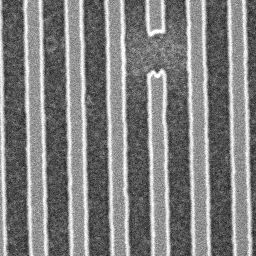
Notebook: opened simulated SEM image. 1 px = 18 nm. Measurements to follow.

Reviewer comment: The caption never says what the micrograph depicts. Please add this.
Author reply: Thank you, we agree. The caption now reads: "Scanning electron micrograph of parallel lines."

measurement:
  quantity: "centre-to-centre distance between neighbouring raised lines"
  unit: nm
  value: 733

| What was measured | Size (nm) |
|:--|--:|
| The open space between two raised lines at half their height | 432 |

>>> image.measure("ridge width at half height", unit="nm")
299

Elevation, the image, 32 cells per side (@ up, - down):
---@@---@@---@@---@@---@@----@@-
---@@---@@---@@---@@---@@@---@@-
---@@---@@---@@---@@----@@---@@-
---@@---@@---@@----@----@@---@@-
---@@---@@---@@---------@@---@@-
---@@---@@---@@---------@@---@@-
---@@---@@---@@---------@@---@@-
---@@---@@---@@@--------@@---@@-
---@@---@@---@@@--------@@---@@-
---@@---@@---@@@---@@---@@---@@-
---@@---@@@---@----@@---@@---@@-
---@@---@@@---@----@@---@@---@@-
---@@---@@----@@---@@---@@---@@-
---@@----@@---@@---@@---@@---@@-
---@@----@----@@---@@---@@---@@-
---@@----@@---@@---@@---@@---@@-
---@@----@@---@@---@@---@@---@@-
----@----@@---@@---@@---@@---@@-
---@@@---@@---@@---@@---@@---@@-
---@@@---@@---@@---@@---@@---@@-
---@@@---@@---@@---@@---@@---@@-
@---@@---@@---@@---@@---@@---@@-
@---@@---@@---@@---@@---@@---@@-
@---@@---@@---@@---@@---@@---@@-
@---@@---@@---@@---@@---@@---@@-
@---@@---@@---@@---@@---@@---@@-
@---@@---@@---@@---@@---@@---@@-
@---@@---@@---@@---@@---@@---@@-
@---@@---@@---@@---@@---@@---@@-
@---@@---@@---@@---@@---@@---@@-
@---@@---@@---@@---@@---@@---@@-
@---@@---@@---@@---@@---@@---@@-